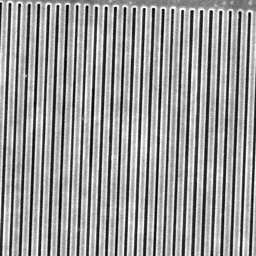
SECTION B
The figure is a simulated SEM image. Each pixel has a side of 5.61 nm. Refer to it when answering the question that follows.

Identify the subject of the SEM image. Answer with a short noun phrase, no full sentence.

parallel lines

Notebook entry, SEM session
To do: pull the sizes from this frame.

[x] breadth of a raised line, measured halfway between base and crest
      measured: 35.1 nm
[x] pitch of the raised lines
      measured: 53.9 nm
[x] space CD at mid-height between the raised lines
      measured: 20.3 nm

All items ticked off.